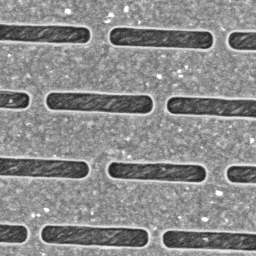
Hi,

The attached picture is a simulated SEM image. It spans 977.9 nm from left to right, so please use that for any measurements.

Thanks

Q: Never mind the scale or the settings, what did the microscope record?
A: holes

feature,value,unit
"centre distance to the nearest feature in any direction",342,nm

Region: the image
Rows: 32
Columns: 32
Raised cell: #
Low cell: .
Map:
################################
################################
################################
...........####..###############
...........###.............##...
########.#####.............##...
################################
################################
################################
################################
################################
...#############################
....##.............##...........
...###.............##...........
###########################.....
################################
################################
################################
################################
################################
...........###..........########
...........###............##....
################.........####...
################################
################################
################################
################################
################################
...##...........################
...##..............#............
#######...........##............
################################